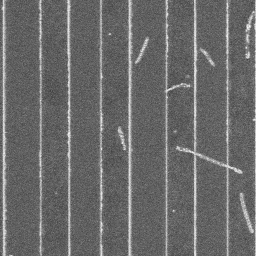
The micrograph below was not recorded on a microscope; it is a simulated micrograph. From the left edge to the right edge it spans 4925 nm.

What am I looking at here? lines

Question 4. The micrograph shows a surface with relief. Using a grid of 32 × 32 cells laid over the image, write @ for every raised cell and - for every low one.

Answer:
@@@@@----@@@@---@@@@@---@@@@----
@@@@@----@@@@---@@@@@---@@@@----
@@@@@----@@@@---@@@@@---@@@@----
@@@@@----@@@@---@@@@@---@@@@----
@@@@@----@@@@---@@@@@---@@@@----
@@@@@----@@@@---@@@@@---@@@@----
@@@@@----@@@@---@@@@@---@@@@----
@@@@@----@@@@---@@@@@---@@@@----
@@@@@----@@@@---@@@@@---@@@@----
@@@@@----@@@@---@@@@@---@@@@----
@@@@@----@@@@---@@@@@---@@@@----
@@@@@----@@@@---@@@@@---@@@@----
@@@@@----@@@@---@@@@@---@@@@----
@@@@@----@@@@---@@@@@---@@@@----
@@@@@----@@@@---@@@@@---@@@@----
@@@@@----@@@@---@@@@@---@@@@----
@@@@@----@@@@---@@@@@---@@@@----
@@@@@----@@@@---@@@@@---@@@@----
@@@@@----@@@@---@@@@@---@@@@----
@@@@@----@@@@---@@@@@---@@@@----
@@@@@----@@@@---@@@@@---@@@@@---
@@@@@----@@@@---@@@@@---@@@@----
@@@@@----@@@@---@@@@@---@@@@----
@@@@@----@@@@---@@@@@---@@@@----
@@@@@----@@@@---@@@@@---@@@@----
@@@@@----@@@@---@@@@@---@@@@----
@@@@@----@@@@---@@@@@---@@@@----
@@@@@----@@@@---@@@@@---@@@@----
@@@@@----@@@@---@@@@@---@@@@----
-@@@@----@@@@---@@@@@---@@@@----
@@@@@----@@@@---@@@@@---@@@@----
-@@@@----@@@@---@@@@@---@@@@----